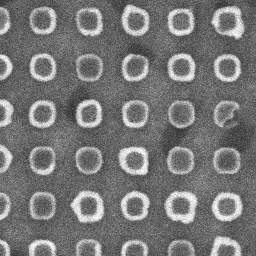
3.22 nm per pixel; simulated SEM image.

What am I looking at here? a regular array of raised bodies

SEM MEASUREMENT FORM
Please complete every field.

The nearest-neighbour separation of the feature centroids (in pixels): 45.7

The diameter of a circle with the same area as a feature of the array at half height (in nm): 86.5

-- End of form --